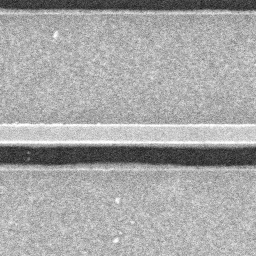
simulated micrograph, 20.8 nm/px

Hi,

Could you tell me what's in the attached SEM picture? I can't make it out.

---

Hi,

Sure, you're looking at lines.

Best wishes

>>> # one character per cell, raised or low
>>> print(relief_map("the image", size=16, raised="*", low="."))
................
****************
****************
****************
****************
****************
****************
****************
****************
................
................
****************
****************
****************
****************
****************